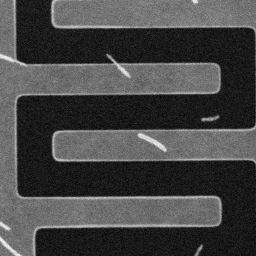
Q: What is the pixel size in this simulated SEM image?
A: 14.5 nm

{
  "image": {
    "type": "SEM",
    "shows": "groups of lines, slits or small figures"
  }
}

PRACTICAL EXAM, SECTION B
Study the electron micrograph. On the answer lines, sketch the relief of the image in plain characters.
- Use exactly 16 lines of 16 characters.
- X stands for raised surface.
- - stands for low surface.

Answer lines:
X--XXXXXXXXXXXXX
X---XXXXXXXXXXXX
X---------------
X---------------
XXXXXXXXXXXXXX--
XXXXXXXXXXXXXX--
X---------------
X---------------
X--XXXXXXXXXXXXX
X--XXXXXXXXXXXXX
X---------------
X---------------
XXXXXXXXXXXXXX--
XXXXXXXXXXXXXX--
XX--------------
XX--------------